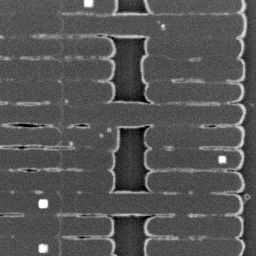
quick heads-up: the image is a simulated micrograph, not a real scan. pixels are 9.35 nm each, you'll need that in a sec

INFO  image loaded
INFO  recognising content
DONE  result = wiring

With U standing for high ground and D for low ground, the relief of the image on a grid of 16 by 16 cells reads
UUUUUUUDDUUUUUUD
UUUUUUUUUUUUUUUD
UUUUUUUDDUUUUUUD
UUUUUUUDDUUUUUUD
UUUUUUUDDUUUUUUD
UUUUUUUDDUUUUUUD
UUUUUUUUUUUUUUUD
UUUUUUUUUUUUUUUD
UUUUUUUDDUUUUUUD
UUUUUUUDDUUUUUUD
UUUUUUUDDUUUUUUD
UUUUUUUDDUUUUUUD
UUUUUUUUUUUUUUUD
UUUUUUUDDUUUUUUD
UUUUUUUDDUUUUUUD
UUUUUUUDDUUUUUUD